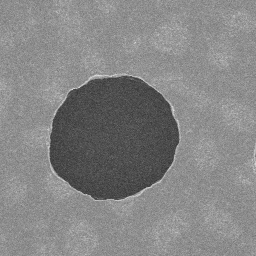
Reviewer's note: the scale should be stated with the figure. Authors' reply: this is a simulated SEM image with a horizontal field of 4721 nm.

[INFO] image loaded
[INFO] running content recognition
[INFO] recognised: holes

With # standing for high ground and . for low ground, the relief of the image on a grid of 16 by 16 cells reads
################
################
################
################
################
#####.....######
####.......#####
###........#####
###........#####
###........#####
###........#####
####......######
################
################
################
################